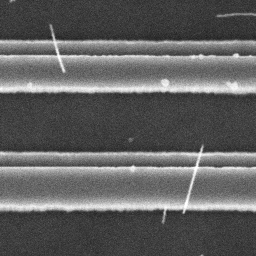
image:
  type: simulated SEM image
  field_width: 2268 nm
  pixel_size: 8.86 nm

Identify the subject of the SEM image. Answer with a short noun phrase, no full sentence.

lines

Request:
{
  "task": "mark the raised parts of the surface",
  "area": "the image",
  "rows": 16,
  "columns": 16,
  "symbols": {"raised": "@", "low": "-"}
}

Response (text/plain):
----------------
----------------
----------------
@@@@@@@@@@@@@@@@
@@@@@@@@@@@@@@@@
@@@@@@@@@@@@@@@@
----------------
----------------
----------------
----------------
@@@@@@@@@@@@@@@@
@@@@@@@@@@@@@@@@
@@@@@@@@@@@@@@@@
----------------
----------------
----------------